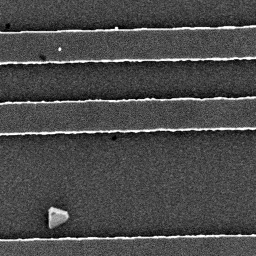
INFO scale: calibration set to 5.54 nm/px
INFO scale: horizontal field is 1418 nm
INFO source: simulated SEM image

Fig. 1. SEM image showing lines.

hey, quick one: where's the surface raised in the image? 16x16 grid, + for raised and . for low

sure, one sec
................
................
++++++++++++++++
++++++++++++++++
................
................
++++++++++++++++
++++++++++++++++
................
................
................
................
................
...+............
................
++++++++++++++++